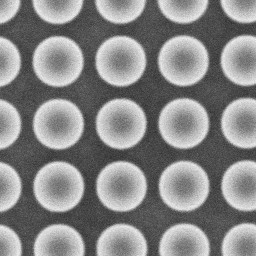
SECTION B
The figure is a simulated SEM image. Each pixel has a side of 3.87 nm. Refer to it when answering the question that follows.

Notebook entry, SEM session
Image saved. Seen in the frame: an array of small figures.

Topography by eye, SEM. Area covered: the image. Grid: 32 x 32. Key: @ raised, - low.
@@--@@@@@@--@@@@@@--@@@@@@--@@@@
@@---@@@@@--@@@@@@--@@@@@---@@@@
@-----@@@-----@@@----@@@-----@@@
--------------------------------
--------------------------------
@@---@@@@----@@@@----@@@@---@@@@
@@--@@@@@@--@@@@@@--@@@@@@--@@@@
@@--@@@@@@--@@@@@@--@@@@@@--@@@@
@@--@@@@@@--@@@@@@--@@@@@@--@@@@
@@---@@@@@---@@@@@--@@@@@---@@@@
@-----@@@-----@@------@@------@@
--------------------------------
--------------@@------@@------@@
@@---@@@@@---@@@@@---@@@@---@@@@
@@--@@@@@@--@@@@@@--@@@@@@--@@@@
@@--@@@@@@--@@@@@@--@@@@@@--@@@@
@@--@@@@@@--@@@@@@--@@@@@@--@@@@
@@---@@@@@---@@@@----@@@@----@@@
-------@-------@------@@--------
--------------------------------
@-----@@@-----@@------@@-----@@@
@@---@@@@@---@@@@@---@@@@@--@@@@
@@--@@@@@@--@@@@@@--@@@@@@--@@@@
@@@-@@@@@@--@@@@@@--@@@@@@--@@@@
@@---@@@@@--@@@@@@--@@@@@@--@@@@
@@---@@@@@---@@@@----@@@@----@@@
--------------------------------
--------------------------------
@-----@@@-----@@@----@@@@----@@@
@@---@@@@@---@@@@@--@@@@@@--@@@@
@@@-@@@@@@--@@@@@@--@@@@@@--@@@@
@@@-@@@@@@--@@@@@@--@@@@@@--@@@@